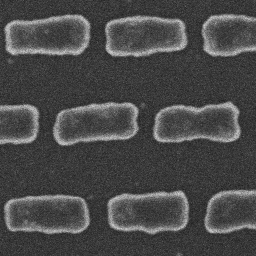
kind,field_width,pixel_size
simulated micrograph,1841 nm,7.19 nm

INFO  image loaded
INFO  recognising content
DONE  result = raised bodies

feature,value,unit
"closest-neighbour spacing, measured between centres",100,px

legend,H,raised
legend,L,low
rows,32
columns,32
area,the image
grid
LLLLLLLLLLLLLLLLLLLLLLLLLLLLLLLL
LLLLLLLLLLLLLLLLLLLLLLLLLLLLLLLL
LLLLLLHHHHHLLLLHHHHHLHLLLLHHHHHH
LHHHHHHHHHHLLHHHHHHHHHHLLHHHHHHH
LHHHHHHHHHHLLHHHHHHHHHHLLHHHHHHH
LHHHHHHHHHHLLHHHHHHHHHHLLLHHHHHH
LLHLLHHHLHLLLLHHHHLLLLLLLLHHHHLL
LLLLLLLLLLLLLLLLLLLLLLLLLLLLLLLL
LLLLLLLLLLLLLLLLLLLLLLLLLLLLLLLL
LLLLLLLLLLLLLLLLLLLLLLLLLLLLLLLL
LLLLLLLLLLLLLLLLLLLLLLLLLLLLLLLL
LLLLLLLLLLLLLLLLLLLLLLLLLLLLLLLL
LLLLLLLLLLLLLLLLLLLLLLLLLLLLLLLL
HHHHLLLLLLHHHHHHHLLLLHHLLHHHHLLL
HHHHHLLHHHHHHHHHHLLLHHHHHHHHHHLL
HHHHHLLHHHHHHHHHHLLLHHHHHHHHHHLL
HHHHLLLHHHHHHHHHHLLHHHHHHHHHHHLL
HHHHLLLHHHLLLLLLLLLLHHHLLLLHHLLL
LLLLLLLLLLLLLLLLLLLLLLLLLLLLLLLL
LLLLLLLLLLLLLLLLLLLLLLLLLLLLLLLL
LLLLLLLLLLLLLLLLLLLLLLLLLLLLLLLL
LLLLLLLLLLLLLLLLLLLLLLLLLLLLLLLL
LLLLLLLLLLLLLLLLLLLLLLLLLLLLLLLL
LLLLLLLLLLLLLLLLLLLLLLLLLLLLLLLL
LLLLLLLLLLLLLLLLLHHHHHHLLLLHHHHH
LHHHHHHHHHHLLLHHHHHHHHHLLLHHHHHH
LHHHHHHHHHHLLLHHHHHHHHHLLLHHHHHH
LHHHHHHHHHHLLLHHHHHHHHHLLLHHHHHH
LHHHHHHHHHHLLLLHHHHHHHHLLLHHHHLL
LLLLLLLLLLLLLLLLLLLLLLLLLLLLLLLL
LLLLLLLLLLLLLLLLLLLLLLLLLLLLLLLL
LLLLLLLLLLLLLLLLLLLLLLLLLLLLLLLL